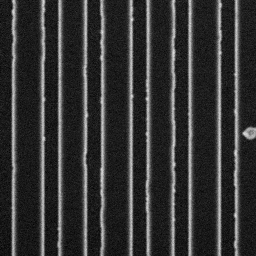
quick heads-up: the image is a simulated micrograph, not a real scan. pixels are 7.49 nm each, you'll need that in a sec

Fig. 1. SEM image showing lines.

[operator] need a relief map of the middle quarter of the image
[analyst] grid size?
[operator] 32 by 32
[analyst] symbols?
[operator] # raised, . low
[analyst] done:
######....#######....######....#
#####.....#######....######....#
######....#######....#######...#
######....#######....#######...#
######....#######....#######...#
######....#######....#######...#
######....#######....#######...#
######....#######....######....#
######...########....######....#
######...########....######....#
######....#######....######....#
######....#######....#######...#
######....#######....######....#
######....#######....######....#
######....#######....#######...#
######....#######....#######...#
######....#######....#######...#
######....#######....#######...#
######....#######....#######...#
######....#######....#######...#
######....#######....#######...#
######....#######....######....#
######....#######....######....#
#####.....#######....######....#
#####.....#######....#######...#
######....#######....#######...#
######...########....######....#
######...########....#######...#
######...########....#######...#
######...########....#######...#
######...########....#######...#
######...########....#######...#